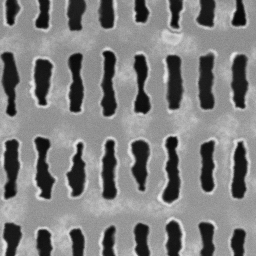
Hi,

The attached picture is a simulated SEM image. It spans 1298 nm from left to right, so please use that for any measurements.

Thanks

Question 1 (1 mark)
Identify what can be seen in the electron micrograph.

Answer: a regular array of holes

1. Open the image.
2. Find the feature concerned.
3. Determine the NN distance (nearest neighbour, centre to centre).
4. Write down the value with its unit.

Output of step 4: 166 nm